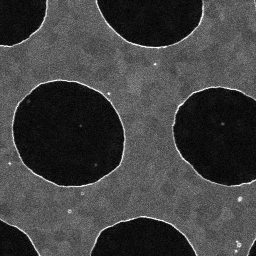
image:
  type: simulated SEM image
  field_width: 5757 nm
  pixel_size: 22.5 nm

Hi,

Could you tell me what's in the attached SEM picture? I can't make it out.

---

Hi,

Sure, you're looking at holes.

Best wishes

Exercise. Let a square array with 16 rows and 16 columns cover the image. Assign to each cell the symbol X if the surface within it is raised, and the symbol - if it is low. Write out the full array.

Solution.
---XXX-------XXX
---XXXX-----XXXX
--XXXXXX---XXXXX
XXXXXXXXXXXXXXXX
XXXXXXXXXXXXXXXX
XX----XXXXXXX-XX
X------XXXX-----
X-------XXX-----
X-------XXX-----
X-------XXX-----
XX-----XXXXX----
XXXX--XXXXXXXX-X
XXXXXXXXXXXXXXXX
XXXXXXXXXXXXXXXX
-XXXXX-----XXXXX
--XXXX------XXXX